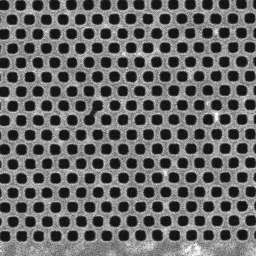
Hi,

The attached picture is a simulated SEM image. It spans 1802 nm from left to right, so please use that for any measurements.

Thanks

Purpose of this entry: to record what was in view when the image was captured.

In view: a regular array of holes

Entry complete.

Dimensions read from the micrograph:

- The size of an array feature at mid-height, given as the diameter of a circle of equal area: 80.2 nm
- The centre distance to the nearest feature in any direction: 116 nm